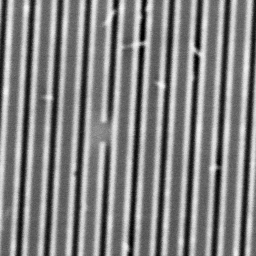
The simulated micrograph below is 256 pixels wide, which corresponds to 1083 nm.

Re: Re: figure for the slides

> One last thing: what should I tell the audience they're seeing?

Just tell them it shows parallel lines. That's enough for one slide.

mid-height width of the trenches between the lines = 45.4 nm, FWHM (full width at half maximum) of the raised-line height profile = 19 nanometers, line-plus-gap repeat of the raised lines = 13.9 px